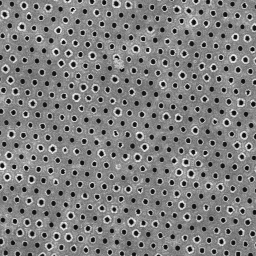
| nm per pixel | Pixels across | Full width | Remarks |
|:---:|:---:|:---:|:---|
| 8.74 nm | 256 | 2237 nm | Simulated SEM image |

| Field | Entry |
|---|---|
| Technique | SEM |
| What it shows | a regular array of holes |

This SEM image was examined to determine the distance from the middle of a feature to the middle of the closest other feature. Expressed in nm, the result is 104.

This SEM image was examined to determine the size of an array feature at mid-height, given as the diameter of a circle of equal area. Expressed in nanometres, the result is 40.7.